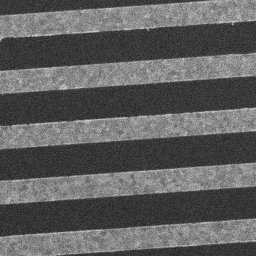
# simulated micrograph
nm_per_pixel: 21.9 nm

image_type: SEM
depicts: parallel lines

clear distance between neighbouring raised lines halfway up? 719 nanometers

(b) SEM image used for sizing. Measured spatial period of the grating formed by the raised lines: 55.1 px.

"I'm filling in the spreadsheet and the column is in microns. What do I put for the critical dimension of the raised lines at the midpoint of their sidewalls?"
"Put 0.489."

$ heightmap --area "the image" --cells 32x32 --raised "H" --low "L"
LLLLLLLLLLLLLLLLLLLLLLHHHHHHHHHH
LLLLLLLLHHHHHHHHHHHHHHHHHHHHHHHH
HHHHHHHHHHHHHHHHHHHHHHHHHHHHHHHH
HHHHHHHHHHHHHHHHHHHLLLLLLLLLLLLL
HHHHLLLLLLLLLLLLLLLLLLLLLLLLLLLL
LLLLLLLLLLLLLLLLLLLLLLLLLLLLLLLL
LLLLLLLLLLLLLLLLLLLLLLLLLLLLLLLL
LLLLLLLLLLLLLLLLLLLLHHHHHHHHHHHH
LLLLLLHHHHHHHHHHHHHHHHHHHHHHHHHH
HHHHHHHHHHHHHHHHHHHHHHHHHHHHHHHL
HHHHHHHHHHHHHHHHHLLLLLLLLLLLLLLL
HHHLLLLLLLLLLLLLLLLLLLLLLLLLLLLL
LLLLLLLLLLLLLLLLLLLLLLLLLLLLLLLL
LLLLLLLLLLLLLLLLLLLLLLLLLLLLLLLL
LLLLLLLLLLLLLLLLLLLHHHHHHHHHHHHH
LLLLLHHHHHHHHHHHHHHHHHHHHHHHHHHH
HHHHHHHHHHHHHHHHHHHHHHHHHHHHHLLL
HHHHHHHHHHHHHHHLLLLLLLLLLLLLLLLL
HLLLLLLLLLLLLLLLLLLLLLLLLLLLLLLL
LLLLLLLLLLLLLLLLLLLLLLLLLLLLLLLL
LLLLLLLLLLLLLLLLLLLLLLLLLLLLLLLH
LLLLLLLLLLLLLLLLLHHHHHHHHHHHHHHH
LLLHHHHHHHHHHHHHHHHHHHHHHHHHHHHH
HHHHHHHHHHHHHHHHHHHHHHHHHHHHLLLL
HHHHHHHHHHHHHHLLLLLLLLLLLLLLLLLL
LLLLLLLLLLLLLLLLLLLLLLLLLLLLLLLL
LLLLLLLLLLLLLLLLLLLLLLLLLLLLLLLL
LLLLLLLLLLLLLLLLLLLLLLLLLLLLLLHH
LLLLLLLLLLLLLLLLHHHHHHHHHHHHHHHH
LLHHHHHHHHHHHHHHHHHHHHHHHHHHHHHH
HHHHHHHHHHHHHHHHHHHHHHHHHHLLLLLL
HHHHHHHHHHHHLLLLLLLLLLLLLLLLLLLL